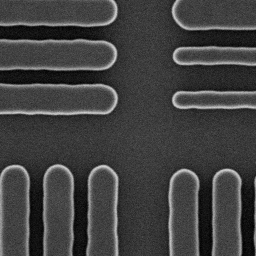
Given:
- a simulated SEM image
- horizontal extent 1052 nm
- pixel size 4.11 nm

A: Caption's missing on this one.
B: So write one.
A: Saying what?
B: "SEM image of groups of lines, slits or small figures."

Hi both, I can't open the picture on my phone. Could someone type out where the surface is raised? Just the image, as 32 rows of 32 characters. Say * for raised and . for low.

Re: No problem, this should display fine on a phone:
**************........**********
***************.......**********
**************........**********
.......................*********
................................
**************..................
**************........**********
**************........**********
*************...................
................................
*...............................
**************........*.***.....
***************.......**********
**************..................
................................
................................
................................
................................
................................
................................
................................
***...***..***........**...**...
****.****..****......****..***..
****.****..****......****..***..
****.****..****......****..***..
****.****..****......****..***..
****.****..****......****..***..
****.****..****......****..***..
****..***..****......****..***..
****.****..****......****..***..
***..****..****......****..***..
****.****..****......****..***..